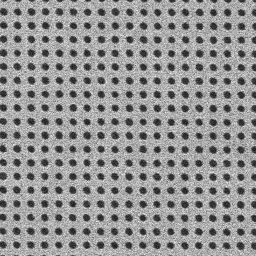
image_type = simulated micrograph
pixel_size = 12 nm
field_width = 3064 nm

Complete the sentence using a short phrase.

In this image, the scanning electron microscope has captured a regular array of holes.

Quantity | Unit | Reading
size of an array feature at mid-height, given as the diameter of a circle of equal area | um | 0.0916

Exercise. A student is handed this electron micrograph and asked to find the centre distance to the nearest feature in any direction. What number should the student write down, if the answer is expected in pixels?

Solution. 13.5